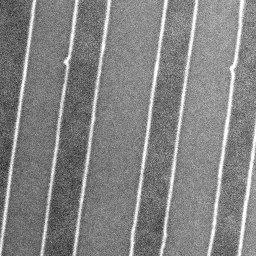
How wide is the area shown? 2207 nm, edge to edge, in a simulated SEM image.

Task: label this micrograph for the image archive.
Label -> one or a few lines or trenches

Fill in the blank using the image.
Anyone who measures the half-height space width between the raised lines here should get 396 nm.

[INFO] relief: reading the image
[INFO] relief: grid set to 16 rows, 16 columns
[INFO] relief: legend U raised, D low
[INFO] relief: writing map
UUDDDUUDDDUUDDDU
UUDDDUUDDDUUDDDU
UUDDUUUDDDUUDDDU
UUDDUUDDDDUUDDDU
UUDDUUDDDDUUDDDU
UDDDUUDDDDUUDDUU
UDDDUUDDDUUDDDUU
UDDDUUDDDUUDDDUU
UDDDUUDDDUUDDDUU
UDDUUUDDDUUDDDUU
UDDUUDDDDUUDDDUU
UDDUUDDDDUUDDDUU
DDDUUDDDDUUDDDUD
DDDUUDDDUUDDDUUD
DDDUUDDDUUDDDUUD
DDDUUDDDUUDDDUUD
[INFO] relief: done